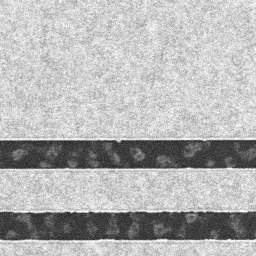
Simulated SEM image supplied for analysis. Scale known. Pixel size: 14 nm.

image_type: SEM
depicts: one or a few lines or trenches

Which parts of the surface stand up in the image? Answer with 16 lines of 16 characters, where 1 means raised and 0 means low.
1111111111111111
1111111111111111
1111111111111111
1111111111111111
1111111111111111
1111111111111111
1111111111111111
1111111111111111
1111111111111111
0000000000000000
0000000000000000
1111111111111111
1111111111111111
0000000000000000
0000000000000000
1111111111111111